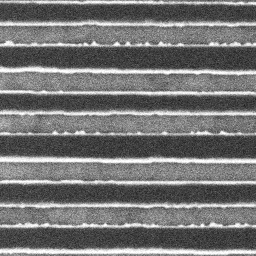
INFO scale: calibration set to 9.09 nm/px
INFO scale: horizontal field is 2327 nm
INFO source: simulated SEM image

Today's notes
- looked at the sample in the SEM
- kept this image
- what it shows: lines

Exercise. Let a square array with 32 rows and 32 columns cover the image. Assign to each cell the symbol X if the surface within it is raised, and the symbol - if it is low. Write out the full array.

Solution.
XXXXXXXXXXXXXXXXXXXXXXXXXXXXXXXX
XXXXXXXXXXXXXXXXXXXXXXXXXXXXXXXX
XXXXXXXXXXXXXXXXXXXXXXXXXXXXXXXX
--------------------------------
--------------------------------
X-------------------------------
XXXXXXXXXXXXXXXXXXXXXXXXXXXXXXXX
XXXXXXXXXXXXXXXXXXXXXXXXXXXXXXXX
XXXXXXXXXXXXXXXXXXXXXXXXXXXXXXXX
--------------------------------
--------------------------------
XXXX----------------------------
XXXXXXXXXXXXXXXXXXXXXXXXXXXXXXXX
XXXXXXXXXXXXXXXXXXXXXXXXXXXXXXXX
--------------------------------
--------------------------------
--------------------------------
XXXXXXXXXXXXXXXXXXXXXXXXXXXXXXXX
XXXXXXXXXXXXXXXXXXXXXXXXXXXXXXXX
XXXXXXXXXXXXXXXXXXXXXXXXXXXXXXXX
--------------------------------
--------------------------------
--------------------------------
XXXXXXXXXXXXXXXXXXXXXXXXXXXXXXXX
XXXXXXXXXXXXXXXXXXXXXXXXXXXXXXXX
XXXXXXXXXXXXXXXXXXXXXXXXXXXXXXXX
--------------------------------
--------------------------------
XXXXXXXXXXXXXXXXXXXXXXXXXXXXXXXX
XXXXXXXXXXXXXXXXXXXXXXXXXXXXXXXX
XXXXXXXXXXXXXXXXXXXXXXXXXXXXXXXX
-------------------------XXX----